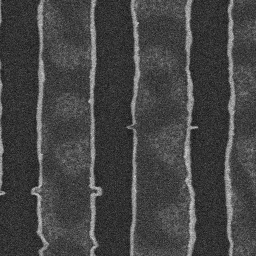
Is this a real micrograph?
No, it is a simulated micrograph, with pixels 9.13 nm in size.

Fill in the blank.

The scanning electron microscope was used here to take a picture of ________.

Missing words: one or a few lines or trenches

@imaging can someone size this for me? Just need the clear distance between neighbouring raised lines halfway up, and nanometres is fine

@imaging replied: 370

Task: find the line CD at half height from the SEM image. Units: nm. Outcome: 494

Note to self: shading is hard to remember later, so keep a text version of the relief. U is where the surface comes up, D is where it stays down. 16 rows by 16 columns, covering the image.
DDDUUUDDUUUUDDUU
DDDUUUDDUUUUDDUU
DDDUUUDDUUUUDDUU
DDDUUUDDDUUUDDUU
DDDUUUDDDUUUDDUU
DDDUUUDDUUUUDDDU
DDUUUUDDUUUUDDUU
DDUUUUDDUUUUDDUU
DDUUUUDDUUUUDDUU
DDUUUUDDUUUUDDUU
DDDUUUDDUUUUDDUU
DDUUUUDDUUUUDDUU
DDUUUUDDUUUUDDUU
DDUUUUDDUUUUDDUU
DDDUUUDDUUUUDDUU
DDDUUUDDUUUUDDUU